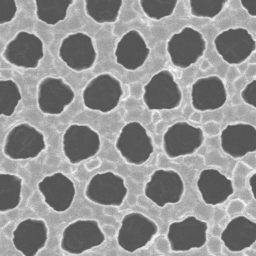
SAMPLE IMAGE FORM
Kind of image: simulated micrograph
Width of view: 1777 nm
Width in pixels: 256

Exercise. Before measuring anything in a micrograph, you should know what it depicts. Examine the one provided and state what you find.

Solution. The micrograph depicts a regular array of holes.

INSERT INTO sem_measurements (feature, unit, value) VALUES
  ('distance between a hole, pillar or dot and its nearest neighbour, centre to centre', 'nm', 341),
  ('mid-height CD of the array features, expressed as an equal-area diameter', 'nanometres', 248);